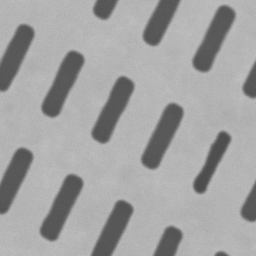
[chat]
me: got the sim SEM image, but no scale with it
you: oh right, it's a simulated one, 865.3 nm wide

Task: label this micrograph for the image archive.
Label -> holes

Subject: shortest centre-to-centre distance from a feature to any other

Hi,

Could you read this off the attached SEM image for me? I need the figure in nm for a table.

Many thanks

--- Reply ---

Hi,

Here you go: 190